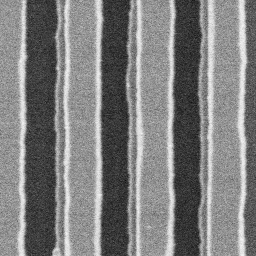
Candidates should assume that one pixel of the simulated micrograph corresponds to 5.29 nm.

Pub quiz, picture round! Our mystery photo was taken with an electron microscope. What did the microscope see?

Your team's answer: lines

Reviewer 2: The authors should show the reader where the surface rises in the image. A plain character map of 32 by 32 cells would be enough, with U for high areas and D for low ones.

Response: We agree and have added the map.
UUUDDDDUUUUUUDDDUUUUUUDDDUUUUUDD
UUUDDDDUUUUUUDDDUUUUUUDDDUUUUUDD
UUUDDDDUUUUUUDDDUUUUUUDDDUUUUUDD
UUUDDDDUUUUUUDDDUUUUUUDDDUUUUUUD
UUUDDDDUUUUUUDDDUUUUUUDDDUUUUUUD
UUUDDDDUUUUUDDDDUUUUUUDDDUUUUUUD
UUUDDDDUUUUUDDDDUUUUUUDDDUUUUUUD
UUUDDDDUUUUUDDDDUUUUUUDDDUUUUUUD
UUUDDDDUUUUUDDDDUUUUUUDDDUUUUUUD
UUUDDDDUUUUUDDDDUUUUUUDDDUUUUUDD
UUUDDDDUUUUUUDDDUUUUUUDDDUUUUUDD
UUUDDDDUUUUUDDDDUUUUUDDDDUUUUUDD
UUUDDDDUUUUUDDDDUUUUUUDDDUUUUUDD
UUUDDDDUUUUUDDDDUUUUUUDDDUUUUUDD
UUUDDDDUUUUUDDDDUUUUUUDDDUUUUUDD
UUUDDDDUUUUUDDDDUUUUUDDDDUUUUUDD
UUUDDDDUUUUUDDDDUUUUUDDDDUUUUUDD
UUUDDDDUUUUUDDDDUUUUUDDDDUUUUUUD
UUUDDDDUUUUUDDDDUUUUUUDDDUUUUUUD
UUUDDDDUUUUUUDDDUUUUUUDDDUUUUUUD
UUUDDDDUUUUUUDDDUUUUUUDDDUUUUUUD
UUUDDDDUUUUUUDDDUUUUUUDDDUUUUUUD
UUUDDDDUUUUUUDDDUUUUUUDDDUUUUUUD
UUUDDDDUUUUUUDDDUUUUUUDDDUUUUUUD
UUUDDDDUUUUUUDDDUUUUUUDDDUUUUUUD
UUUDDDDUUUUUUDDDUUUUUUDDDUUUUUDD
UUUDDDDUUUUUDDDDUUUUUUDDDUUUUUDD
UUUDDDDUUUUUDDDDUUUUUUDDDUUUUUDD
UUUDDDDUUUUUDDDDUUUUUUDDDUUUUUDD
UUUDDDDUUUUUDDDDUUUUUUDDDUUUUUDD
UUUDDDDUUUUUDDDDUUUUUUDDDUUUUUDD
UUUDDDDUUUUUDDDDUUUUUUDDDUUUUUDD